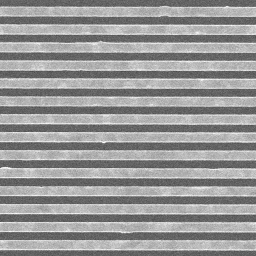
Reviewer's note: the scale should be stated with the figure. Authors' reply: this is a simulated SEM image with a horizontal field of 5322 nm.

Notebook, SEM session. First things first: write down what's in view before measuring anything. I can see parallel lines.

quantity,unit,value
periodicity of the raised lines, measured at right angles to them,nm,374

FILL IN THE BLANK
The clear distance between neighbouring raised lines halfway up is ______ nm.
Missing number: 177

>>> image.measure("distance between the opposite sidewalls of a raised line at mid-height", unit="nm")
195